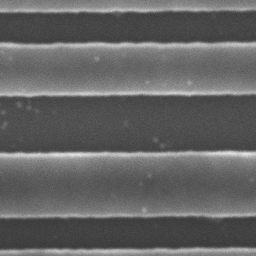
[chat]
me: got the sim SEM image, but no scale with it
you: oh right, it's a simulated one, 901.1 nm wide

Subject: lines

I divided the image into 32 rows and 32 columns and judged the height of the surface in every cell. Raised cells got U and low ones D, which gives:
UUUUUUUUUUUUUUUUUUUUUUUUUUUUUUUU
DDDDDDDDDDDDDDDDDDDDDDDDDDDDDDDD
DDDDDDDDDDDDDDDDDDDDDDDDDDDDDDDD
DDDDDDDDDDDDDDDDDDDDDDDDDDDDDDDD
DDDDDDDDDDDDDDDDDDDDDDDDDDDDDDDD
UUDDDDDDDDDUUUDUUDUUDDDDUUUUUUUU
UUUUUUUUUUUUUUUUUUUUUUUUUUUUUUUU
UUUUUUUUUUUUUUUUUUUUUUUUUUUUUUUU
UUUUUUUUUUUUUUUUUUUUUUUUUUUUUUUU
UUUUUUUUUUUUUUUUUUUUUUUUUUUUUUUU
UUUUUUUUUUUUUUUUUUUUUUUUUUUUUUUU
UUUUUUUUUUUUUUUUUUUUUUUUUUUUUUUU
DDDDDDDDDDDDDDDDDDDDDDDDDDDDDDDD
DDDDDDDDDDDDDDDDDDDDDDDDDDDDDDDD
DDDDDDDDDDDDDDDDDDDDDDDDDDDDDDDD
DDDDDDDDDDDDDDDDDDDDDDDDDDDDDDDD
DDDDDDDDDDDDDDDDDDDDDDDDDDDDDDDD
DDDDDDDDDDDDDDDDDDDDDDDDDDDDDDDD
DDDDDDDDDDDDDDDDDDDDDDDDDDDDDDDD
UUUUUUUUUUUUUUUUUUUUUUUUUUUUUUUU
UUUUUUUUUUUUUUUUUUUUUUUUUUUUUUUU
UUUUUUUUUUUUUUUUUUUUUUUUUUUUUUUU
UUUUUUUUUUUUUUUUUUUUUUUUUUUUUUUU
UUUUUUUUUUUUUUUUUUUUUUUUUUUUUUUU
UUUUUUUUUUUUUUUUUUUUUUUUUUUUUUUU
UUUUUUUUUUUUUUUUUUUUUUUUUUUUUUUU
UUUUUUUUUUUUUUUUUUUUUUUUUUUUUUUU
DDDDDDDDDDDDDDDDDDDDDDDDDDDDDDDD
DDDDDDDDDDDDDDDDDDDDDDDDDDDDDDDD
DDDDDDDDDDDDDDDDDDDDDDDDDDDDDDDD
DDDDDDDDDDDDDDDDDDDDDDDDDDDDDDDD
UUUUUUUUUUUUUUUUUUUUUUUUUUUUUUUU